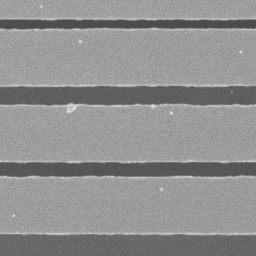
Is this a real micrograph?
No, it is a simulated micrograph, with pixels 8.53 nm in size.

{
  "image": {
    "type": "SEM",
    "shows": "lines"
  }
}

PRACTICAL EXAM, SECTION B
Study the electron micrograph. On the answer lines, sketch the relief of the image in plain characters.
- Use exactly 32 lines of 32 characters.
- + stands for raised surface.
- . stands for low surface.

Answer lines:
++++++++++++++++++++++++++++++++
++++++++++++++++++++++++++++++++
................................
................................
++++++++++++++++++++++++++++++++
++++++++++++++++++++++++++++++++
++++++++++++++++++++++++++++++++
++++++++++++++++++++++++++++++++
++++++++++++++++++++++++++++++++
++++++++++++++++++++++++++++++++
++++++++++++++++++++++++++++++++
................................
................................
++++++++++++++++++++++++++++++++
++++++++++++++++++++++++++++++++
++++++++++++++++++++++++++++++++
++++++++++++++++++++++++++++++++
++++++++++++++++++++++++++++++++
++++++++++++++++++++++++++++++++
++++++++++++++++++++++++++++++++
................................
................................
++++++++++++++++++++++++++++++++
++++++++++++++++++++++++++++++++
++++++++++++++++++++++++++++++++
++++++++++++++++++++++++++++++++
++++++++++++++++++++++++++++++++
++++++++++++++++++++++++++++++++
++++++++++++++++++++++++++++++++
................................
................................
................................